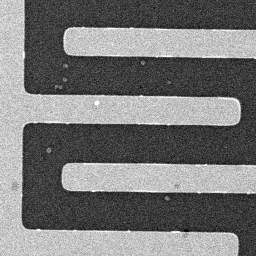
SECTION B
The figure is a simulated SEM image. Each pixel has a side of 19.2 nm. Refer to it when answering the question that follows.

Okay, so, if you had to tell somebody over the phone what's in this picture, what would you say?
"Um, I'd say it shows groups of lines, slits or small figures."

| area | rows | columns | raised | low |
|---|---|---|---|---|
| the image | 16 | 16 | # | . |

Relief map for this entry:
##..............
##..............
#...############
#.......########
#...............
##..............
###############.
###############.
#...............
#...............
#...############
#...############
#...............
#...............
##########......
###############.